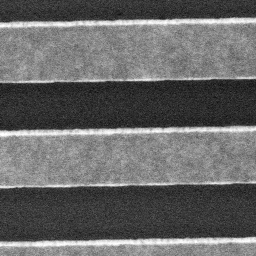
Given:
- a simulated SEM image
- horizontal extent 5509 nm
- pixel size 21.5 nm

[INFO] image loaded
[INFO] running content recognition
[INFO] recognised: lines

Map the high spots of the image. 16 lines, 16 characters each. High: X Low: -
----------------
--XXXXXXXXXXXXXX
XXXXXXXXXXXXXXXX
XXXXXXXXXXXXXXXX
XXXXXXXXXXXXXXXX
----------------
----------------
----------------
XXXXXXXXXXXXXXXX
XXXXXXXXXXXXXXXX
XXXXXXXXXXXXXXXX
XXXXXXXXXXX-----
----------------
----------------
----------------
XXXXXXXXXXXXXXXX